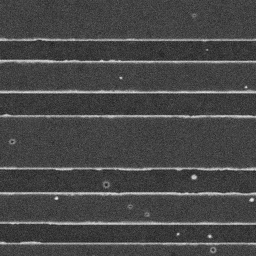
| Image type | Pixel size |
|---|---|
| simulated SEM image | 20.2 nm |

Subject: lines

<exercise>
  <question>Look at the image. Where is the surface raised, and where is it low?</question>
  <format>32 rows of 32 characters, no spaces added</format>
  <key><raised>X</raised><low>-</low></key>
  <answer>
XXXXXXXXXXXXXXXXXXXXXXXXXXXXXXXX
XXXXXXXXXXXXXXXXXXXXXXXXXXXXXXXX
XXXXXXXXXXXXXXXXXXXXXXXXXXXXXXXX
XXXXXXXXXXXXXXXXXXXXXXXXXXXXXXXX
XXXXXXXXXXXXXXXXXXXXXXXXXXXXXXXX
--------------------------------
--------------------------------
--------------------------------
XXXXXXXXXXXXXXXXXXXXXXXXXXXXXXXX
XXXXXXXXXXXXXXXXXXXXXXXXXXXXXXXX
XXXXXXXXXXXXXXXXXXXXXXXXXXXXXXXX
XXXXXXXXXXXXXXXXXXXXXXXXXXXXXXXX
--------------------------------
--------------------------------
X-------------------------------
XXXXXXXXXXXXXXXXXXXXXXXXXXXXXXXX
XXXXXXXXXXXXXXXXXXXXXXXXXXXXXXXX
XXXXXXXXXXXXXXXXXXXXXXXXXXXXXXXX
XXXXXXXXXXXXXXXXXXXXXXXXXXXXXXXX
XXXXXXXXXXXXXXXXXXXXXXXXXXXXXXXX
XXXXXXXXXXXXXXXXXXXXXXXXXXXXXXXX
--------------------------------
--------------------------------
--------------------------------
XXXXXXXXXXXXXXXXXXXXXXXXXXXXXXXX
XXXXXXXXXXXXXXXXXXXXXXXXXXXXXXXX
XXXXXXXXXXXXXXXXXXXXXXXXXXXXXXXX
XXXXXXXXXXXXXXXXXXXXXXXXXXXXXXXX
--------------------------------
--------------------------------
XXXXXXXXXXXXXXXXXXXXXXXXXXXXXXXX
XXXXXXXXXXXXXXXXXXXXXXXXXXXXXXXX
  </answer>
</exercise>